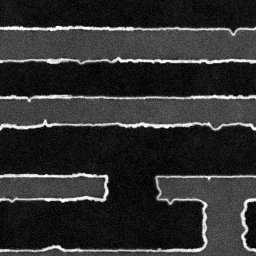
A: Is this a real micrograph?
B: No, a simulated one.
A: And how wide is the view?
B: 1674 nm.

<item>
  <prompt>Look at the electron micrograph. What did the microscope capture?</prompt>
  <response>one or a few lines or trenches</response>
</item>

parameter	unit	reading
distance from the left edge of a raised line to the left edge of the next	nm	477